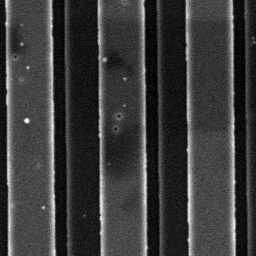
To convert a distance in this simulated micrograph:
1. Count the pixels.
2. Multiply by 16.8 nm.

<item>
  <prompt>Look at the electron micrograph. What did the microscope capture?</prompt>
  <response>lines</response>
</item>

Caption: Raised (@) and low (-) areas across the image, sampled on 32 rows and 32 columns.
-@@@@@------@@@@@@-----@@@@@@---
-@@@@@------@@@@@@-----@@@@@@---
-@@@@@------@@@@@@-----@@@@@@---
-@@@@@@-----@@@@@@-----@@@@@@---
-@@@@@@-----@@@@@@-----@@@@@@---
-@@@@@@-----@@@@@@-----@@@@@@---
-@@@@@@-----@@@@@@-----@@@@@@---
-@@@@@@-----@@@@@@-----@@@@@@---
-@@@@@@-----@@@@@@-----@@@@@@---
-@@@@@@-----@@@@@@-----@@@@@@---
-@@@@@@-----@@@@@@-----@@@@@@---
-@@@@@@-----@@@@@@-----@@@@@@---
-@@@@@@-----@@@@@@-----@@@@@@---
-@@@@@@-----@@@@@@-----@@@@@@---
-@@@@@@-----@@@@@@-----@@@@@@---
-@@@@@@-----@@@@@@------@@@@@---
-@@@@@@-----@@@@@@------@@@@@---
-@@@@@@------@@@@@------@@@@@---
-@@@@@@------@@@@@-----@@@@@@---
-@@@@@@------@@@@@------@@@@@---
-@@@@@@------@@@@@------@@@@@---
-@@@@@@------@@@@@------@@@@@---
-@@@@@@------@@@@@------@@@@@---
-@@@@@@------@@@@@------@@@@@---
-@@@@@@------@@@@@------@@@@@---
-@@@@@@------@@@@@------@@@@@---
-@@@@@@------@@@@@------@@@@@---
-@@@@@@------@@@@@------@@@@@---
-@@@@@@------@@@@@------@@@@@---
-@@@@@@------@@@@@------@@@@@---
-@@@@@@------@@@@@------@@@@@---
-@@@@@@------@@@@@------@@@@@---